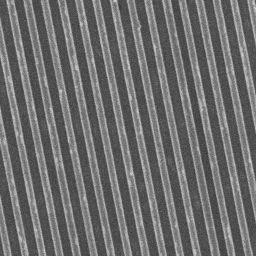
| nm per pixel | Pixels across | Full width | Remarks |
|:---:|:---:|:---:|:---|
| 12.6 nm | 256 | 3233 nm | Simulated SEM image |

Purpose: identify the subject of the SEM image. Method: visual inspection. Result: parallel lines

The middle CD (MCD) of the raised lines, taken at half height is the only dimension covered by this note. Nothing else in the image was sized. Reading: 85.3 nanometers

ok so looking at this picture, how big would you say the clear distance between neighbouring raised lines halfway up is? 127 nm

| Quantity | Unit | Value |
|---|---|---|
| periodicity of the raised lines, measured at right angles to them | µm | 0.213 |